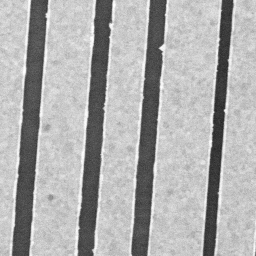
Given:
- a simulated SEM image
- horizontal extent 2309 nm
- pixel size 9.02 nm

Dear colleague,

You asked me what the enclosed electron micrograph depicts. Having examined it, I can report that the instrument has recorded one or a few lines or trenches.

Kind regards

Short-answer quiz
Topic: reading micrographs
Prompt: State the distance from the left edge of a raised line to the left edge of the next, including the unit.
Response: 60.9 pixels